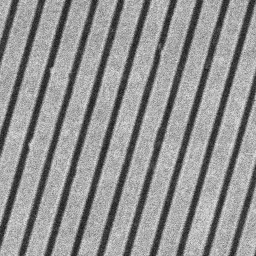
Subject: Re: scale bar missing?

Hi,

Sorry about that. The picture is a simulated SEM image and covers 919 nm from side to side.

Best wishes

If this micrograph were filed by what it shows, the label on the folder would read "parallel lines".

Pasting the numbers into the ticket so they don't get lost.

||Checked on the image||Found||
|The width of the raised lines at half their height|59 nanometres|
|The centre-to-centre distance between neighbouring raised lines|0.0907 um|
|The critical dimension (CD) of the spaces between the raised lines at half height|0.0314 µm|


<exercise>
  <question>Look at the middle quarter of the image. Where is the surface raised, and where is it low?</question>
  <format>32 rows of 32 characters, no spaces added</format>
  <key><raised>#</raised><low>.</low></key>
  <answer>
##..####...####..#####..####...#
##..####...####..####...####..##
#...####..####...####..####...##
#..#####..####...####..####...##
#..####...####..####...####..###
...####..####...####...####..###
..#####..####...####..#####..###
..####...####..####...####...###
..####..#####..####...####..####
..####..####...####..#####..####
.#####..####...####..####...####
.####...####..####...####..####.
.####..#####..####...####..####.
#####..####...####..####...####.
####...####..####...####...####.
####..#####..####...####..####..
####..####...####..####...####..
####..####..####...####...####..
###...####..####...####..####...
###..####...####..####...####...
###..####...####..####...####..#
##...####..####...####..#####..#
##..#####..####...####..####...#
##..####...####..####...####...#
#...####..#####..####...####..##
#...####..####...####..####...##
#..#####..####..####...####...##
...####...####..####...####..###
...####..####...####..####...###
..#####..####...####..####...###
..####...####..####...####..####
..####..####...####...####..####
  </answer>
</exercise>